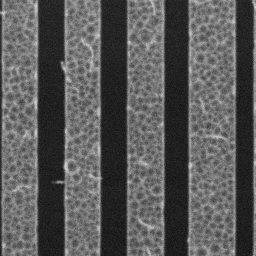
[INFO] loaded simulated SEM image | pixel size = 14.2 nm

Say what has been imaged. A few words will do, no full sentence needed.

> one or a few lines or trenches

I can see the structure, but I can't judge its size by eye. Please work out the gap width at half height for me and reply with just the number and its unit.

0.384 um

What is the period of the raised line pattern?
908 nm